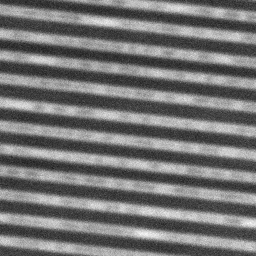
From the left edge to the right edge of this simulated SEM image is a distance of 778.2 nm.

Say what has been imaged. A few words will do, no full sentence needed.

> parallel lines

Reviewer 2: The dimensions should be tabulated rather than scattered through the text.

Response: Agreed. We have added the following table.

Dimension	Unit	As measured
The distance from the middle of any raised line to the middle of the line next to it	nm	69.5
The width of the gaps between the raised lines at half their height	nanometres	47.9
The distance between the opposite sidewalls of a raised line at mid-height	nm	21.5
